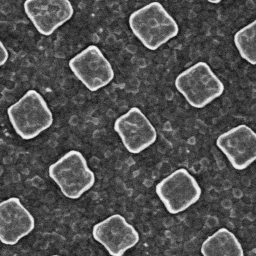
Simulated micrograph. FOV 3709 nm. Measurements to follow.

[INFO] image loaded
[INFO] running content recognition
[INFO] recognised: raised bodies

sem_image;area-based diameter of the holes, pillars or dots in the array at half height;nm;586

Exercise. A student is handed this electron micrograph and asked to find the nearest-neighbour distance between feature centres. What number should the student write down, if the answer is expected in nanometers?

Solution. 1070